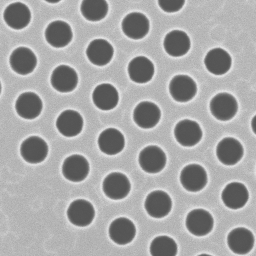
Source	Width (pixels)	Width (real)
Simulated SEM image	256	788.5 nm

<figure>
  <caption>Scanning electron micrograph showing a regular array of holes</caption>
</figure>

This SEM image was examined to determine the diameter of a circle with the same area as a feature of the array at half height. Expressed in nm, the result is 78.5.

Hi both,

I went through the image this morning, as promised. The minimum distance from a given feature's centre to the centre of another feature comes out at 137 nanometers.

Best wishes